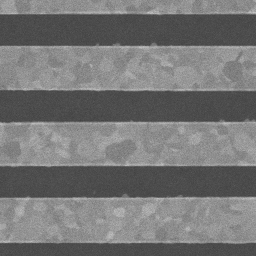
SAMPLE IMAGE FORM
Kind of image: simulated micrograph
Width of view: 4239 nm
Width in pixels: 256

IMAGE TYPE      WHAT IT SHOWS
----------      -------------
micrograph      lines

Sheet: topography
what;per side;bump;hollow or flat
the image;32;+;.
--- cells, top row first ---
++++++++++++++++++++++++++++++++
++++++++++++++++++++++++++++++++
................................
................................
................................
................................
++++++++++++++++++++++++++++++++
++++++++++++++++++++++++++++++++
++++++++++++++++++++++++++++++++
++++++++++++++++++++++++++++++++
++++++++++++++++++++++++++++++++
................................
................................
................................
................................
++++++++++++++++++++++++++++++++
++++++++++++++++++++++++++++++++
++++++++++++++++++++++++++++++++
++++++++++++++++++++++++++++++++
++++++++++++++++++++++++++++++++
++++++++++++++++++++++++++++++++
................................
................................
................................
................................
++++++++++++++++++++++++++++++++
++++++++++++++++++++++++++++++++
++++++++++++++++++++++++++++++++
++++++++++++++++++++++++++++++++
++++++++++++++++++++++++++++++++
................................
................................